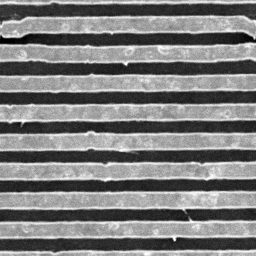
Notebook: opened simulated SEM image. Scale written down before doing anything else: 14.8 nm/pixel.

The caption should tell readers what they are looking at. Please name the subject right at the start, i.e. parallel lines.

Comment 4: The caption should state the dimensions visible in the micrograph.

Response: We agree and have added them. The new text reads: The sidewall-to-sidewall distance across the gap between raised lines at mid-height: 0.186 um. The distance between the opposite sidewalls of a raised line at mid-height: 0.247 microns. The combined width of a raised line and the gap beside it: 0.431 microns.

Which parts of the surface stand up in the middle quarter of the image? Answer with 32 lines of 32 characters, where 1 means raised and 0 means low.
00000000000000000000000000000000
00000000000000000000000000000000
00000000000000000000000000000000
11111111111111111111111111111111
11111111111111111111111111111111
11111111111111111111111111111111
11111111111111111111111111111111
00000000000000000000000000000000
00000000000000000000000000000000
00000000000000000000000000000000
11111111111111111111111111111111
11111111111111111111111111111111
11111111111111111111111111111111
11111111111111111111111111111111
00000000000000000000000000000000
00000000000000000000000000000000
00000000000000000000000000000000
11111111111110000000000011100000
11111111111111111111111111111111
11111111111111111111111111111111
11111111111111111111111111111111
00001000000001111110000000000000
00000000000000000000000000000000
00000000000000000000000000000000
00000000000000000000000000000000
11111111111111111111111111111111
11111111111111111111111111111111
11111111111111111111111111111111
11111111111111111111101111111101
00000000000000000000000000000000
00000000000000000000000000000000
00000000000000000000000000000000